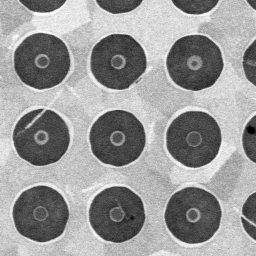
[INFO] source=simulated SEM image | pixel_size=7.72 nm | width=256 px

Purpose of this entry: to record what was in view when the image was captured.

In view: an array of small figures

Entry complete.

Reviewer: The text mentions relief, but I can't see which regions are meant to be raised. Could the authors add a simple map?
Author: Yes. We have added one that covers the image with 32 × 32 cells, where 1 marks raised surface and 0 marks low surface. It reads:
11100000111100000011110000011110
11110001111110001111111000111111
11111111111111111111111111111111
11111111111111111111111111111111
11100001111110001111111000111111
11000000111100000111110000011110
11000000011000000011100000001110
11000100011000100011100010001100
11000000011000000011100000001100
11000000111000000011100000011110
11100001111100000111110000011111
11111111111111111111111111111111
11111111111111111111111111111111
11110111111111111111111111111111
11100000111100000111110000011110
11000000011100000011100000011110
11000000011000000011100000001100
11000100011000100011100110001100
11000000011000000011100000001100
11000000111100000011100000011110
11110011111110001111110000111111
11111111111111111111111111111111
11111111111111111111111111111111
11110001111110001111111001111111
11000000111100000111100000011110
11000000111000000011100000001100
10001100011000100011100010001100
11000000011000100011100000001100
11000000111000000011100000011100
11100000111100000111100000011110
11111111111111111111111001111111
11111111111111111111111111111111